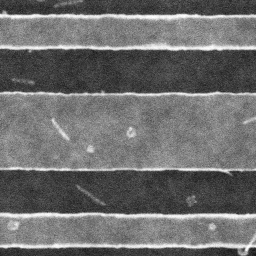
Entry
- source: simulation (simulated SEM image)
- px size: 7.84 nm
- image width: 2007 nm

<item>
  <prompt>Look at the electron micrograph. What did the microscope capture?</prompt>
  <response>lines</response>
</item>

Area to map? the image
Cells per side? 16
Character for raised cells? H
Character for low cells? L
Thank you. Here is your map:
LLLLLLLLLLLLLLLL
HHHHHHHHHHHHHHHH
HHHHHHHHHHHHHHHH
LLLLLLLLLLLLLLLL
LLLLLLLLLLLLLLLL
LLLLLLLLLLLLLLLL
HHHHHHHHHHHHHHHH
HHHHHHHHHHHHHHHH
HHHHHHHHHHHHHHHH
HHHHHHHHHHHHHHHH
HHHHHHHHHHHHHHHH
LLLLLLLLLLLLLLLL
LLLLLLLLLLLLLLLL
HHHHHHHHHHHHHHHH
HHHHHHHHHHHHHHHH
LLLLLLLLLLLLLLLL